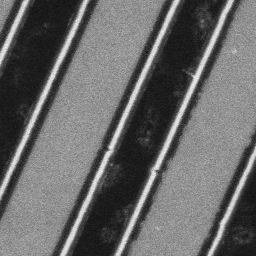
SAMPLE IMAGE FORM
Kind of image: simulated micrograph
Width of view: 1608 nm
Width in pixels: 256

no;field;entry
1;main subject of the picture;one or a few lines or trenches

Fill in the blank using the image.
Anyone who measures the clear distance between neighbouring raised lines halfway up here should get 81.5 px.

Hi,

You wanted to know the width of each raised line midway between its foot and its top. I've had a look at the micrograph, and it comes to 319 nanometers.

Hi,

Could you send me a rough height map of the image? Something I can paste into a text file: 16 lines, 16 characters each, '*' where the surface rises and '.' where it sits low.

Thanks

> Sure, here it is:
.****......***..
.****.....****..
.***......***...
****.....****...
***......***....
***......***....
***.....****....
**......***.....
**.....****.....
*......***......
*.....****.....*
......***......*
.....****......*
.....***......**
.....***......**
....****.....***